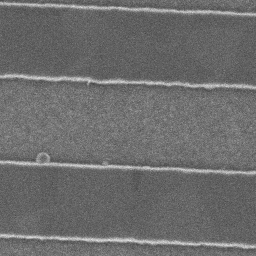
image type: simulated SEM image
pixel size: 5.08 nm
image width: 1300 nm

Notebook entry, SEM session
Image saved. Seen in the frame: one or a few lines or trenches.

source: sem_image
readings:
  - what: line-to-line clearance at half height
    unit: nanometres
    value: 433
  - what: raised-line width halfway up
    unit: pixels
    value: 73.4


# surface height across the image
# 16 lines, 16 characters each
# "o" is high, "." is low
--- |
ooooooo.........
oooooooooooooooo
oooooooooooooooo
oooooooooooooooo
oooooooooooooooo
................
................
................
................
................
ooooooooo.......
oooooooooooooooo
oooooooooooooooo
oooooooooooooooo
oooooooooooooooo
................